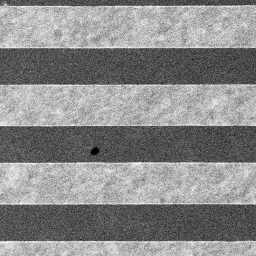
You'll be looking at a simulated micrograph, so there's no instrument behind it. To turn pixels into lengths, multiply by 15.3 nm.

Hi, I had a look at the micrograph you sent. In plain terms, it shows one or a few lines or trenches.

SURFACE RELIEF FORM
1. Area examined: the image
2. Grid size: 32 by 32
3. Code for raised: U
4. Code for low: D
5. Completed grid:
UDDDDDDDDDDDDDDDDDDDDDDDDDDDDDDD
UUUUUUUUUUUUUUUUUUUUUUUUUUUUUUUU
UUUUUUUUUUUUUUUUUUUUUUUUUUUUUUUU
UUUUUUUUUUUUUUUUUUUUUUUUUUUUUUUU
UUUUUUUUUUUUUUUUUUUUUUUUUUUUUUUU
UUUUUUUUUUUUUUUUUUUUUUUUUUUUUUUU
DDDDDDDDDDDDDDDDDDDDDDDDDDDDDDDD
DDDDDDDDDDDDDDDDDDDDDDDDDDDDDDDD
DDDDDDDDDDDDDDDDDDDDDDDDDDDDDDDD
DDDDDDDDDDDDDDDDDDDDDDDDDDDDDDDD
DDDDDDDDDDDDDDDDDDDDDDDDDDDDDDDD
UUUUUUUUUUUUUUUUUUUUUUUUUUUUUUUU
UUUUUUUUUUUUUUUUUUUUUUUUUUUUUUUU
UUUUUUUUUUUUUUUUUUUUUUUUUUUUUUUU
UUUUUUUUUUUUUUUUUUUUUUUUUUUUUUUU
UUUUUUUUUUUUUUUUUUUUUUUUUUUUUUUU
DDDDDDDDDDDDDDDDDDDDDDDDDDDDDDDD
DDDDDDDDDDDDDDDDDDDDDDDDDDDDDDDD
DDDDDDDDDDDDDDDDDDDDDDDDDDDDDDDD
DDDDDDDDDDDDDDDDDDDDDDDDDDDDDDDD
UUDDDDDUUUUUUUUUUUUUUUUUUUUUUUUU
UUUUUUUUUUUUUUUUUUUUUUUUUUUUUUUU
UUUUUUUUUUUUUUUUUUUUUUUUUUUUUUUU
UUUUUUUUUUUUUUUUUUUUUUUUUUUUUUUU
UUUUUUUUUUUUUUUUUUUUUUUUUUUUUUUU
DDDDDDDDDDDDDDDDDDDDDDDDDDDDDDDD
DDDDDDDDDDDDDDDDDDDDDDDDDDDDDDDD
DDDDDDDDDDDDDDDDDDDDDDDDDDDDDDDD
DDDDDDDDDDDDDDDDDDDDDDDDDDDDDDDD
DDDDDDDDDDDDDDDDDDDDDDDDDDDDDDDD
UUUUUUUUUUUUUUUUUUUUUUUUUUUUUUUU
UUUUUUUUUUUUUUUUUUUUUUUUUUUUUUUU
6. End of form